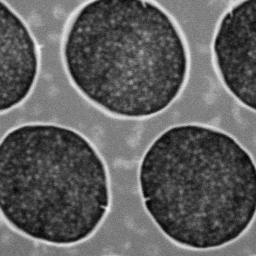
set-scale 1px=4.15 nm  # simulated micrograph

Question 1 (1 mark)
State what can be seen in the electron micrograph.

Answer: holes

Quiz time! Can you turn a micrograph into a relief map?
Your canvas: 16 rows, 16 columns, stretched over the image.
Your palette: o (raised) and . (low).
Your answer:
.oooo.....ooooo.
.ooo.......ooo..
..oo.......oo...
..oo........o...
..oo........oo..
..ooo......ooo..
.ooooo.....oooo.
oooooooooooooooo
o....ooooo....oo
......ooo......o
.......oo.......
.......oo.......
.......oo.......
......oooo......
o.....oooo.....o
oooooooooooooooo